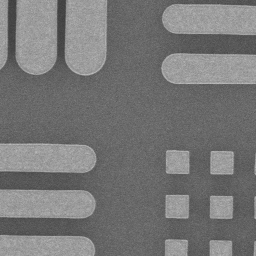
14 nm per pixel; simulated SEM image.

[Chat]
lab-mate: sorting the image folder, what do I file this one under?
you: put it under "groups of lines, slits or small figures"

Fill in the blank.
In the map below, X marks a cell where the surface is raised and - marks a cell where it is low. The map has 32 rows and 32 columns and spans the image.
X-XXXXX-XXXXX-------------------
X-XXXXX-XXXXX--------XXXXXXXXXXX
X-XXXXX-XXXXX-------XXXXXXXXXXXX
X-XXXXX-XXXXX--------XXXXXXXXXXX
X-XXXXX-XXXXX-------------------
X-XXXXX-XXXXX-------------------
X-XXXXX-XXXXX-------------------
X-XXXXX-XXXXX--------XXXXXXXXXXX
---XXX---XXXX-------XXXXXXXXXXXX
---------------------XXXXXXXXXXX
--------------------------------
--------------------------------
--------------------------------
--------------------------------
--------------------------------
--------------------------------
--------------------------------
--------------------------------
XXXXXXXXXXX---------------------
XXXXXXXXXXXX---------XXX--XXX---
XXXXXXXXXXXX---------XXX--XXX---
---------------------XX----XX---
--------------------------------
--------------------------------
XXXXXXXXXXX----------XX---------
XXXXXXXXXXXX---------XXX--XXX---
XXXXXXXXXXXX---------XXX--XXX---
--------------------------------
--------------------------------
XX------------------------------
XXXXXXXXXXXX---------XX---XXX---
XXXXXXXXXXXX---------XX---XXX---